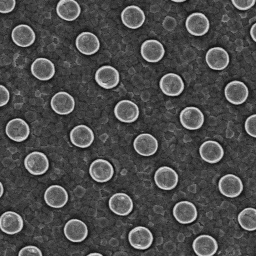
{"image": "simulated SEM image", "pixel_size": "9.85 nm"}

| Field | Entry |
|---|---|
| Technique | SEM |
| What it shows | a regular array of raised bodies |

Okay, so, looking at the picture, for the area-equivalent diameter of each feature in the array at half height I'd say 220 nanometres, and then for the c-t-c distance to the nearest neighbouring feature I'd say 381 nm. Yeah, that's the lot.